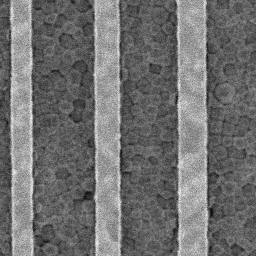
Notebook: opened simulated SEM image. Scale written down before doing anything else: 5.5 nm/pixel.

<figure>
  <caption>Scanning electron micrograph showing one or a few lines or trenches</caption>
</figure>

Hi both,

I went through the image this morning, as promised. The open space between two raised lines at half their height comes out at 338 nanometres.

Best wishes